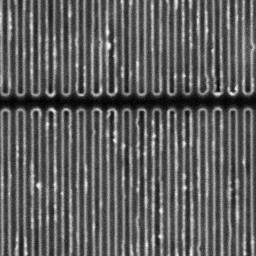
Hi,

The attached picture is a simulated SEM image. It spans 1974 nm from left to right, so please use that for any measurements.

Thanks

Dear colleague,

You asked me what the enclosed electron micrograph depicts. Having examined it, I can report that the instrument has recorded parallel lines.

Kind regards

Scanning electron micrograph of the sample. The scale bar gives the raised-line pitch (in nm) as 117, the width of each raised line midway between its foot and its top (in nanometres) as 72.3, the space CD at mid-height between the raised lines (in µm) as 0.0463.